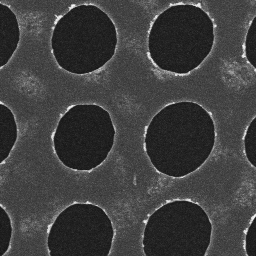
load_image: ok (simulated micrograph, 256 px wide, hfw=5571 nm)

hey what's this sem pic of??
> holes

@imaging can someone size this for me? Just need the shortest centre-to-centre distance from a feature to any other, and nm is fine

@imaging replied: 2100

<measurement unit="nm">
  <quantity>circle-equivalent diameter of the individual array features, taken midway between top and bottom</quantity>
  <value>1460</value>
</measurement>